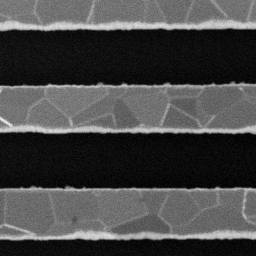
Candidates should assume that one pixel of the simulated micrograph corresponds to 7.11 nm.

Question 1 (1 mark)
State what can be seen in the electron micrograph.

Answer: lines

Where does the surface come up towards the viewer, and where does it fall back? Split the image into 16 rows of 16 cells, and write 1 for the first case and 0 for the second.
1111111111111111
1111111111111111
0000000000000000
0000000000000000
0000000000000000
1111111111111111
1111111111111111
1111111111111111
0000000000000000
0000000000000000
0000000000000000
0000000000000000
1111111111111111
1111111111111111
1111111111111111
0000000000000000